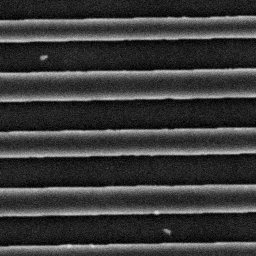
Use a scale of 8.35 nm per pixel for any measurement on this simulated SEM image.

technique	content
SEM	lines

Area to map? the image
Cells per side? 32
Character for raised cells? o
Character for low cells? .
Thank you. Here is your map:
................................
................................
...........ooooooooooooooooooooo
oooooooooooooooooooooooooooooooo
oooooooooooooooooooooooooooooooo
................................
................................
................................
................................
oooooooooooooooooooooooooooooooo
oooooooooooooooooooooooooooooooo
oooooooooooooooooooooooooooooooo
ooooooooo.......................
................................
................................
................................
.ooooooooooooooooooooooooooooooo
oooooooooooooooooooooooooooooooo
oooooooooooooooooooooooooooooooo
ooooooooo.o.....................
................................
................................
................................
.......ooooooooooooooooooooooooo
oooooooooooooooooooooooooooooooo
oooooooooooooooooooooooooooooooo
ooooooooooooooooooooooooooooo.o.
................................
................................
................................
....................oooooooooooo
oooooooooooooooooooooooooooooooo